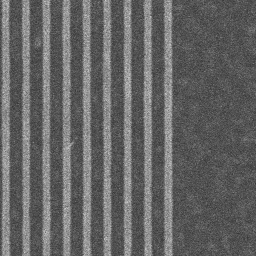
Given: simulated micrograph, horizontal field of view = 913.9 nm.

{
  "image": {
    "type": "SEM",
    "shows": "parallel lines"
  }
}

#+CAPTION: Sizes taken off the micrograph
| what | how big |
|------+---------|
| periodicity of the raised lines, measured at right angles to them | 0.0725 micrometres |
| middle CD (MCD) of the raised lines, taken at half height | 22.3 nm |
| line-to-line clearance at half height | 49.9 nm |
